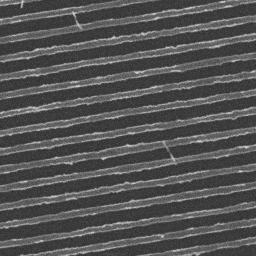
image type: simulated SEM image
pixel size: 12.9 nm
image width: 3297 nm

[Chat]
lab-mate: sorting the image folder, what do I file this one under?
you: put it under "parallel lines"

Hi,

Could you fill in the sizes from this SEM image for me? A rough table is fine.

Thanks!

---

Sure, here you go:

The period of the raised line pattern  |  236 nanometers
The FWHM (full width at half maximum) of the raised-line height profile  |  90.6 nanometres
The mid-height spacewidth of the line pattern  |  11.5 pixels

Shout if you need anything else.